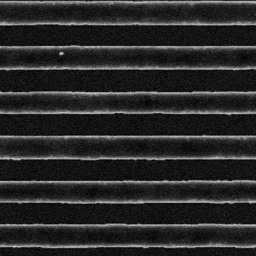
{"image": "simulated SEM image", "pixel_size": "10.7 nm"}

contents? lines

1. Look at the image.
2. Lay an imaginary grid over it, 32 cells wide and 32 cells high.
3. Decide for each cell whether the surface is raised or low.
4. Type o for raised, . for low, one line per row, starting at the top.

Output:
oooooooooooooooooooooooooooooooo
oooooooooooooooooooooooooooooooo
oooooooooooooooooooooooooooooooo
................................
................................
................................
oooooooooooooooooooooooooooooooo
oooooooooooooooooooooooooooooooo
oooooooo.ooo.o...oooooooooooooo.
................................
................................
................................
oooooooooooooooooooooooooooooooo
oooooooooooooooooooooooooooooooo
................................
................................
................................
oooooooooooooooooooooooooooooooo
oooooooooooooooooooooooooooooooo
oooooooooooooooooooooooooooooooo
................................
................................
................................
oooooooooooooooooooooooooooooooo
oooooooooooooooooooooooooooooooo
................................
................................
................................
oooooooooooooooooooooooooooooooo
oooooooooooooooooooooooooooooooo
oooooooooooooooooooooooooooooooo
................................